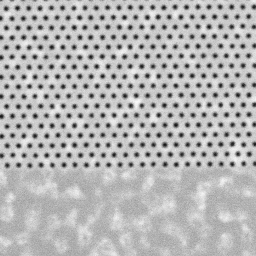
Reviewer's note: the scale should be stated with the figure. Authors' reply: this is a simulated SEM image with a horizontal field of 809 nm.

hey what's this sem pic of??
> a regular array of holes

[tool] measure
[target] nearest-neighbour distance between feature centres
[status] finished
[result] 34 nm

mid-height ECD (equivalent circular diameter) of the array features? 16.7 nm